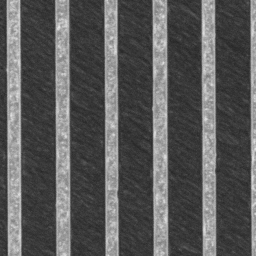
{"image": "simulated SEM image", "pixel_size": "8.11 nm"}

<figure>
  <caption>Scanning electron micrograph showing parallel lines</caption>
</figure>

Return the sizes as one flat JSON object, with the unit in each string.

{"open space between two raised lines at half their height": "289 nm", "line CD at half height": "101 nanometers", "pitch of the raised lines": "395 nanometers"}